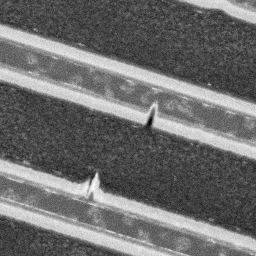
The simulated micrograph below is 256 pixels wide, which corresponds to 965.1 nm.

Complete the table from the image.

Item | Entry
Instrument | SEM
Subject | one or a few lines or trenches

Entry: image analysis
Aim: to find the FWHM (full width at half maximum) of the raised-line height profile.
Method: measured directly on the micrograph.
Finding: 162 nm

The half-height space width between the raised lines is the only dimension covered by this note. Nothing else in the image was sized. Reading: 321 nanometers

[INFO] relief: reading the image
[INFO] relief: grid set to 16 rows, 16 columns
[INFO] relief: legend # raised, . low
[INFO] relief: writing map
..............##
................
##..............
#####...........
#########.......
...#########....
......#########.
..........######
............####
...............#
#...............
####............
#######.........
.#########......
....##########..
........########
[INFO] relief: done